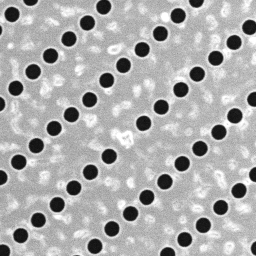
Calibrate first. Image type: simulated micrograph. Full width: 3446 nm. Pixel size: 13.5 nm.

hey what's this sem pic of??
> a regular array of holes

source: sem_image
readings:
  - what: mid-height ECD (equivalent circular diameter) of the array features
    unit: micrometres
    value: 0.209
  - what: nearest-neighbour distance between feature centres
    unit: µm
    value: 0.318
